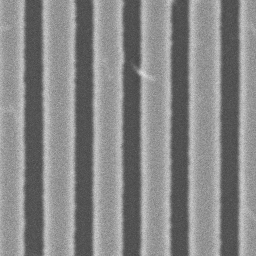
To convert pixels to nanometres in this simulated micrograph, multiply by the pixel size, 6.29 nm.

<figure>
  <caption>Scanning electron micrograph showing lines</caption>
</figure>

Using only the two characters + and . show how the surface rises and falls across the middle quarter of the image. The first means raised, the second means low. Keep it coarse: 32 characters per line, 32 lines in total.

+++....++++++++....++++++++....+
+++....++++++++...+++++++++....+
+++....++++++++....++++++++....+
+++....++++++++....++++++++....+
+++....++++++++....++++++++....+
+++....++++++++....++++++++....+
+++....++++++++....++++++++....+
+++....++++++++....++++++++....+
+++....++++++++....++++++++....+
+++....++++++++....++++++++....+
+++....++++++++....++++++++....+
+++....++++++++....++++++++....+
+++.....+++++++....++++++++....+
+++....++++++++....++++++++....+
+++....++++++++....++++++++....+
+++....++++++++....++++++++....+
+++....++++++++....++++++++....+
+++....++++++++....++++++++....+
+++....++++++++....++++++++....+
+++....++++++++....++++++++....+
+++....+++++++.....++++++++....+
+++....++++++++....++++++++....+
+++....++++++++....++++++++....+
+++....++++++++....++++++++....+
+++....++++++++....++++++++....+
+++....++++++++....++++++++....+
+++....++++++++....++++++++....+
+++....++++++++....++++++++....+
+++....++++++++....++++++++....+
+++....++++++++....++++++++....+
+++....++++++++....++++++++....+
++.....++++++++....++++++++....+